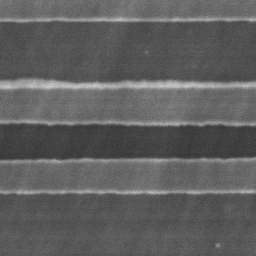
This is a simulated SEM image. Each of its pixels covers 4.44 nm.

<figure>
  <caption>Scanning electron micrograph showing lines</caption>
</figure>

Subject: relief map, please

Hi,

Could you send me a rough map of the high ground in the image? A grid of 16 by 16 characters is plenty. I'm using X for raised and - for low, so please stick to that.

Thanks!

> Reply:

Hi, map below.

XXXXXXXXXXXXXXXX
----------------
----------------
----------------
----------------
XXXXXXXXXXXXXXXX
XXXXXXXXXXXXXXXX
XXXXXXXXXXXXXXXX
----------------
----------------
XXXXXXXXXXXXXXXX
XXXXXXXXXXXXXXXX
----------------
----------------
----------------
----------------